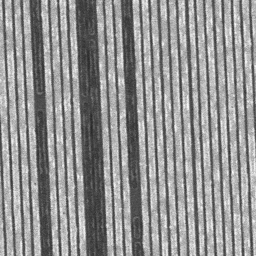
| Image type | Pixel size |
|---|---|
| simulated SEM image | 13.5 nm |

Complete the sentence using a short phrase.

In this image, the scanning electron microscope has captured parallel lines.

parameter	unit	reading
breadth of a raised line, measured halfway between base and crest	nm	79.3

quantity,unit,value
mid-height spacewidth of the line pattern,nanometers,40.5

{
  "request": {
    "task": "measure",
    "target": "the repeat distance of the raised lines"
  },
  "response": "123 nanometres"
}